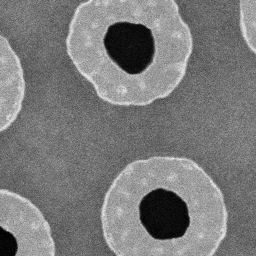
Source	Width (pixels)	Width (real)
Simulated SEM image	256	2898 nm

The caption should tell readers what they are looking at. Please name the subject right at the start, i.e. ring-shaped raised bodies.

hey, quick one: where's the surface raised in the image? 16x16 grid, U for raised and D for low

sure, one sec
DDDDDUUUUUUDDDDU
DDDDDUUDDUUUDDDU
DDDDUUUDDDUUDDDU
UDDDUUUDDDUUDDDD
UDDDDUUUDUUDDDDD
UDDDDDUUUUUDDDDD
UDDDDDDDUDDDDDDD
UDDDDDDDDDDDDDDD
DDDDDDDDDDDDDDDD
DDDDDDDDDDDDDDDD
DDDDDDDDUUUUDDDD
DDDDDDDUUUUUUDDD
UUDDDDDUUDDUUUDD
UUUDDDUUUDDDUUDD
DUUDDDDUUDDDUUDD
DUUDDDDUUUUUUDDD